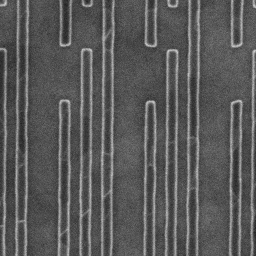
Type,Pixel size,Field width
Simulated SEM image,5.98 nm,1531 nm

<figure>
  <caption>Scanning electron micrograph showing wiring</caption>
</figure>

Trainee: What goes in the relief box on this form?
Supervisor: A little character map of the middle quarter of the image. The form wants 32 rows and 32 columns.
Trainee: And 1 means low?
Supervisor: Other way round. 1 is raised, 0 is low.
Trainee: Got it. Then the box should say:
00001110001100000000000000110001
00001110001100000000000000110001
00001110001100000000000000110001
00001110001100000000000000110001
00001110001100000000000000110001
00001110001100000000000000110001
00001110001100000000000000110001
00001110001100000000000000110001
00001110001100000000000000110001
10001110001100000000010000110001
10001110001100000000011000110001
10001110001100000000011000110001
10001110001100000000011000110001
10001110001100000000011000110001
10001110001100000000011000110001
10001110001100000000111000110001
10001110001100000000111000110001
10001110001100000000111000110001
10001110001100000000111000110001
10001110001100000000111000110001
10001110001100000000111000110001
10001110001100000000111000110001
10001110001100000000111000110001
10001110001100000000111000110001
10001110001100000000111000110001
10001110001100000000111000110001
10001110001100000000111000110001
10001110001100000000111000110001
10001110001100000000111000110001
10001110001100000000111000110001
10001110001100000000111000110001
10001110001100000000111000110001